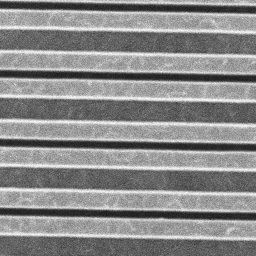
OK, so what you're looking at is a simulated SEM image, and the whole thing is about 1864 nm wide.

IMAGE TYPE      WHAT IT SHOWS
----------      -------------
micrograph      parallel lines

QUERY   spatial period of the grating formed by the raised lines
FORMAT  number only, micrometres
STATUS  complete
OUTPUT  0.251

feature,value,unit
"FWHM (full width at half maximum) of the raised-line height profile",141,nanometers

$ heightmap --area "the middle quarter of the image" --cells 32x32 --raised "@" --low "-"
@@@@@@@@@@@@@@@@@@@@@@@@@@@@@@@@
@@@@@@@@@@@@@@@@@@@@@@@@@@@@@@@@
--------------------------------
--------------------------------
@@@@@@@@@@@@@@@@@@@@@@@@@@@@@@@@
@@@@@@@@@@@@@@@@@@@@@@@@@@@@@@@@
@@@@@@@@@@@@@@@@@@@@@@@@@@@@@@@@
@@@@@@@@@@@@@@@@@@@@@@@@@@@@@@@@
-------@@@@@@@@@@@@@@@@@@@@@@@@@
--------------------------------
--------------------------------
--------------------------------
--------------------------------
--------------------------------
@@@@@@@@@@@---------------------
@@@@@@@@@@@@@@@@@@@@@@@@@@@@@@@@
@@@@@@@@@@@@@@@@@@@@@@@@@@@@@@@@
@@@@@@@@@@@@@@@@@@@@@@@@@@@@@@@@
@@@@@@@@@@@@@@@@@@@@@@@@@@@@@@@@
---------------------@@@@@@@--@@
--------------------------------
@@@@@@@@@@@@@@@@@@@@@@@@--------
@@@@@@@@@@@@@@@@@@@@@@@@@@@@@@@@
@@@@@@@@@@@@@@@@@@@@@@@@@@@@@@@@
@@@@@@@@@@@@@@@@@@@@@@@@@@@@@@@@
@@@@@@@@@@@@@@@@@@@@@@@@@@@@@@@@
--------------------------------
--------------------------------
--------------------------------
--------------------------------
--------------------------------
--------------------------------